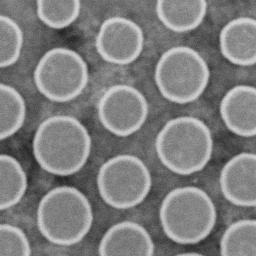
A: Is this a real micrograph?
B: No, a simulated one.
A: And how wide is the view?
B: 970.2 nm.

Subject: a regular array of raised bodies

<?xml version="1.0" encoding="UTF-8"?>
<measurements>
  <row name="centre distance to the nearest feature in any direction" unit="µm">0.26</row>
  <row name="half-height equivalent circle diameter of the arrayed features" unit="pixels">50.8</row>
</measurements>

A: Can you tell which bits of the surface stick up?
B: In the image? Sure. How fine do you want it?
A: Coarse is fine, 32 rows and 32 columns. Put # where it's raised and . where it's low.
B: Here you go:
.....#####..........#####.......
.....#####..........#####.......
#....####.....#.....#####.......
##...........####.....##....####
##..........######..........####
##..........######..........####
##....###....####....###....####
##...#####....##....#####....###
.....######.........######......
.....######.........######......
.....#####..........######......
##...#####....###...#####....###
##...........#####....##....####
###..........#####..........####
###..........#####..........####
##...#####...####....####...####
#....######...##....######....##
....#######.........######......
....#######.........######......
.....######.........######....##
##...#####...#####...####....###
###....##....#####....##....####
###.........#######.........####
###..........#####..........####
##....####...#####...#####..####
#....######...###....#####....##
.....######.........#######.....
.....######.........#######.....
#....######...###....#####...###
###...####...#####...####...####
###..........######.........####
###..........######.........####